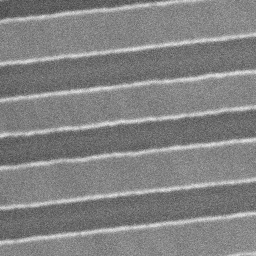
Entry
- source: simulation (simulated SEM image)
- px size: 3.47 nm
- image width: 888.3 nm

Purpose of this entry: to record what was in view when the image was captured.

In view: lines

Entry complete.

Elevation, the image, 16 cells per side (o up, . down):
.......ooooooooo
oooooooooooooooo
oooooooooooooo..
ooooo...........
...............o
......oooooooooo
oooooooooooooooo
ooooooooo.......
................
.........ooooooo
oooooooooooooooo
oooooooooooooo..
ooooo...........
..............oo
.....ooooooooooo
oooooooooooooooo